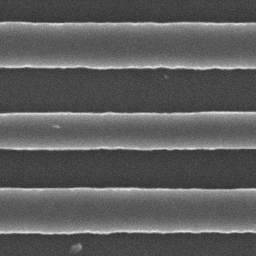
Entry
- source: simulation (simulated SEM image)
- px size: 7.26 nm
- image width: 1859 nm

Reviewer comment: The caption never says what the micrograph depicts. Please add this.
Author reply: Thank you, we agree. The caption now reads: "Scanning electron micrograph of lines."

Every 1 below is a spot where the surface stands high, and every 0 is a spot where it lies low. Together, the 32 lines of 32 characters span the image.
00000000000000000000000000000000
00000000000000000000000000000000
00000000000000000000000000000000
11111111111111111111111111111111
11111111111111111111111111111111
11111111111111111111111111111111
11111111111111111111111111111111
11111111111111111111111111111111
00000000000011000000000011001000
00000000000000000000000000000000
00000000000000000000000000000000
00000000000000000000000000000000
00000000000000000000000000000000
00000000000000000000000000000000
11111111111111111111111111111111
11111111111111111111111111111111
11111111111111111111111111111111
11111111111111111111111111111111
11111111111111111111111111111111
00000000000000000000000000000000
00000000000000000000000000000000
00000000000000000000000000000000
00000000000000000000000000000000
00000000000000000000000000000000
11111111111111111111111111111111
11111111111111111111111111111111
11111111111111111111111111111111
11111111111111111111111111111111
11111111111111111111111111111111
00000000000000000000000000000000
00000000000000000000000000000000
00000000000000000000000000000000